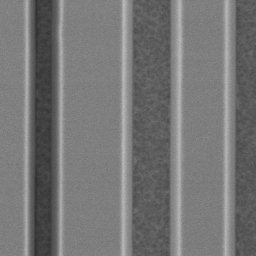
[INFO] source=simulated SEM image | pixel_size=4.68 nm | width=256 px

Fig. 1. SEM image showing one or a few lines or trenches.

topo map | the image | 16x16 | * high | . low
**..****...***..
**..****...***..
**..****...***..
**..****...***..
**..****...***..
**..****...***..
**..****...***..
**..****...***..
**..****...***..
**..****...***..
**..****...***..
**..****...***..
**..****...***..
**..****...***..
**..****...***..
**..****...***..